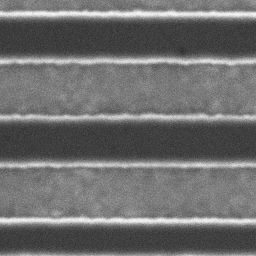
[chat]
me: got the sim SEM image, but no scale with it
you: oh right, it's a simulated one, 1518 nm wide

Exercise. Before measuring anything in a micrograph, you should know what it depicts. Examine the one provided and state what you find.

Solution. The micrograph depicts lines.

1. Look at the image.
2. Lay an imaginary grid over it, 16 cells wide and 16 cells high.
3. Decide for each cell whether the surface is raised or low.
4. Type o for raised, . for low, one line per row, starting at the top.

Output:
................
oooooooooooooooo
oooooooooooooooo
oooooooooooooooo
................
................
................
oooooooooooooooo
oooooooooooooooo
oooooooooooooooo
................
................
................
................
oooooooooooooooo
oooooooooooooooo